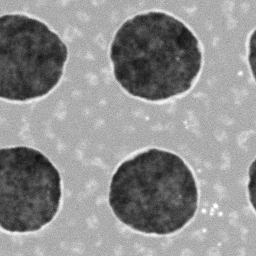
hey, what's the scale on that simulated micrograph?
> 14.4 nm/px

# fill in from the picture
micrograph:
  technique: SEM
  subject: holes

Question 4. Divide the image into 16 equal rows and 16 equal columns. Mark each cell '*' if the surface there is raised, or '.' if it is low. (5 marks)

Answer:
****************
...*****...*****
....***.....****
....***......***
....***.....****
...*****....****
****************
****************
****************
..*******..*****
...****.....****
....***.....****
....***.....****
...****.....****
*.*******..*****
****************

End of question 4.